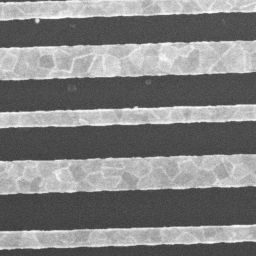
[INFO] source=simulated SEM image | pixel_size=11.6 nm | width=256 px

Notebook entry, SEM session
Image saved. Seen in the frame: lines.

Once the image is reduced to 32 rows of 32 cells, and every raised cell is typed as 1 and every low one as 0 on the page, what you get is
11111111111111111111111111111111
11111111111111111111111111110000
00000000000000000000000000000000
00000000000000000000000000000000
00000000000000000000000000000000
00000000000000000000111111111111
11111111111111111111111111111111
11111111111111111111111111111111
11111111111111111111111111111111
11111111111111000000000000000000
00000000000000000000000000000000
00000000000000000000000000000000
00000000000000000000000000000000
00000000000000000000011111111111
11111111111111111111111111111111
11111111111111000000000000000000
00000000000000000000000000000000
00000000000000000000000000000000
00000000000000000000000000000000
00000000000000000000000001111111
11111111111111111111111111111111
11111111111111111111111111111111
11111111111111111111111111111111
11111111111111111111000000000000
00000000000000000000000000000000
00000000000000000000000000000000
00000000000000000000000000000000
00000000000000000000000000000000
00000000000000000000000111111111
11111111111111111111111111111111
11111111111111111111000000000000
00000000000000000000000000000000